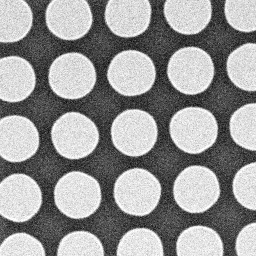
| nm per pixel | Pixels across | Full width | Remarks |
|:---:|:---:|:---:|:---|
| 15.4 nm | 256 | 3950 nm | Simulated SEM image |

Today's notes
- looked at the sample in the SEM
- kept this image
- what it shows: an array of small figures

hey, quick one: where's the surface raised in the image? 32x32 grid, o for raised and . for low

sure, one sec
ooo...ooooo..oooooo..ooooo..oooo
oooo..ooooo..oooooo..ooooo..oooo
oooo..ooooo..oooooo..ooooo..oooo
oooo..ooooo...oooo....ooo....ooo
ooo....ooo.....oo...............
................................
................o.....oooo...ooo
ooo....oooo...ooooo..ooooo..oooo
oooo..oooooo..ooooo..oooooo.oooo
oooo..oooooo.oooooo..oooooo..ooo
oooo..oooooo..ooooo...oooo...ooo
oooo...oooo....ooo.....oo.......
.oo.............................
........................o.....oo
.o......oo.....oooo...ooooo..ooo
oooo...ooooo..ooooo..oooooo..ooo
ooooo..ooooo..oooooo.oooooo..ooo
ooooo..ooooo..ooooo...ooooo..ooo
ooooo..ooooo...oooo....ooo.....o
oooo....ooo.....................
...............................o
.........o......oo.....ooo....oo
.ooo...ooooo...ooooo..ooooo..ooo
ooooo..ooooo..oooooo..ooooo..ooo
ooooo..oooooo.oooooo..ooooo..ooo
ooooo..ooooo...ooooo..ooooo...oo
oooo....oooo....ooo.....o.......
.oo.............................
........................oo.....o
.ooo....oooo....oooo..ooooo...oo
ooooo...ooooo..ooooo..oooooo..oo
oooooo.oooooo..ooooo..oooooo..oo